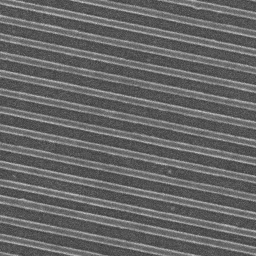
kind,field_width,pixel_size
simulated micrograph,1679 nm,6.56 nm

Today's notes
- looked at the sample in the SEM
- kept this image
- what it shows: parallel lines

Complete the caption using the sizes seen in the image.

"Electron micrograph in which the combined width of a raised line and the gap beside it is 0.117 micrometres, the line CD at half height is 44.2 nanometers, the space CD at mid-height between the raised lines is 76.4 nm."